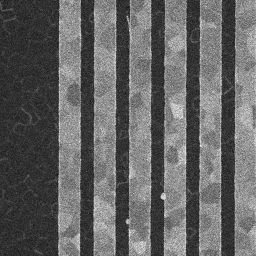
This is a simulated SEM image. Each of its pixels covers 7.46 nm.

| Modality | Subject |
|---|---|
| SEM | parallel lines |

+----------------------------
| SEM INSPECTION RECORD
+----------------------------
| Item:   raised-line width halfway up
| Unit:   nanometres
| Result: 159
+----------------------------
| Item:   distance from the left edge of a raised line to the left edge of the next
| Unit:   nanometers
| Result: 262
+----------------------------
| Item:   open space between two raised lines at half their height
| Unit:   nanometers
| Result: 105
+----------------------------